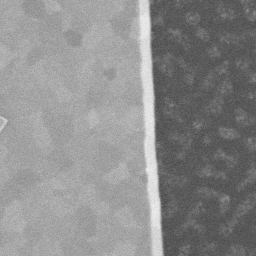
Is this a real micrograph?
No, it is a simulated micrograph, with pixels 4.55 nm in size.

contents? one or a few lines or trenches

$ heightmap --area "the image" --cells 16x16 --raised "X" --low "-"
XXXXXXXXX-------
XXXXXXXXX-------
XXXXXXXXX-------
XXXXXXXXX-------
XXXXXXXXX-------
XXXXXXXXX-------
XXXXXXXXX-------
XXXXXXXXX-------
XXXXXXXXX-------
XXXXXXXXX-------
XXXXXXXXX-------
XXXXXXXXXX------
XXXXXXXXXX------
XXXXXXXXXX------
XXXXXXXXXX------
XXXXXXXXXX------